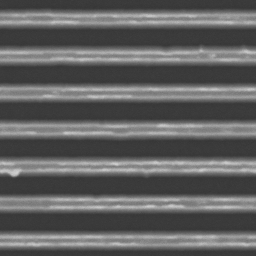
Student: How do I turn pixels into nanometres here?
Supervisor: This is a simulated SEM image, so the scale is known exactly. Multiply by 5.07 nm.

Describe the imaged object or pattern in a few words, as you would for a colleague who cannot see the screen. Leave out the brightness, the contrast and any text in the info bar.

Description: parallel lines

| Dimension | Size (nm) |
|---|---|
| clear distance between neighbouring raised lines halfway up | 112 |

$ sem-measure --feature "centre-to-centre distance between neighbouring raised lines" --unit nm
187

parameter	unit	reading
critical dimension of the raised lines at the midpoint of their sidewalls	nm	77.3